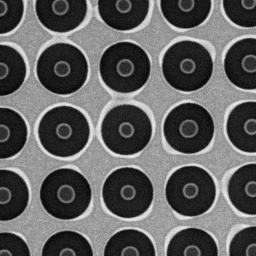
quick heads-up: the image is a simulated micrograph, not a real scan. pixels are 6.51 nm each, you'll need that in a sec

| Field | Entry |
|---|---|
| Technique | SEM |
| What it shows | an array of small figures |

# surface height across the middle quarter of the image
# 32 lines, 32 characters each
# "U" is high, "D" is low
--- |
UDDDDDUUUDDDDUUUUDDDDDUUDDDDDUUU
UDDDDDUUUDDDDUUUUDDDDDUUDDDDDDUU
UDDDDDUUUDDDDDUUUDDDDDUUUDDDDDDD
DDDDDDUUUDDDDDDDDDDDDUUUUDDDDDDD
DDDDDUUUUDDDDDDDDDDDDUUUUUDDDDDD
DDDDDUUUUUDDDDDDDDDDUUUUUUUDDDDD
DDDDUUUUUUUDDDDDDDDUUUUUUUUUDDDD
DDUUUUUUUUUUDDDDDUUUUUUUUUUUUUUU
UUUUUUUUUUUUUUUUUUUUUUUUUUUUUUUU
UUUUUUUUUUUUUDDDDUUUUUUUUUUUUUDD
DDUUUUUUUUUDDDDDDDDUUUUUUUUUDDDD
DDDDUUUUUUDDDDDDDDDDDUUUUUUDDDDD
DDDDDUUUUUDDDDDDDDDDDDUUUUDDDDDD
DDDDDDUUUDDDDDDDDDDDDDUUUDDDDDDD
DDDDDDUUUDDDDDDDDDDDDDUUUDDDDDUU
UDDDDDDUUDDDDDUUUDDDDDUUUDDDDUUU
UUDDDDDUUDDDDDUUUDDDDDUUUDDDDUUU
UUDDDDDUUDDDDDUUUDDDDDUUUDDDDDUU
DDDDDDDUUDDDDDDDDDDDDDUUUDDDDDDD
DDDDDDUUUDDDDDDDDDDDDUUUUDDDDDDD
DDDDDDUUUUDDDDDDDDDDDUUUUUDDDDDD
DDDDDUUUUUUDDDDDDDDUUUUUUUDDDDDD
DDDDUUUUUUUUDDDDDDUUUUUUUUUUUUDD
DDUUUUUUUUUUUUUUUUUUUUUUUUUUUUUU
UUUUUUUUUUUUUUUUUUUUUUUUUUUUUUUU
UUUUUUUUUUUUUUUUUUUUUUUUUUUUUUDD
DDDUUUUUUUUUDDDDDDDUUUUUUUUUDDDD
DDDDUUUUUUUDDDDDDDDDUUUUUUDDDDDD
DDDDDUUUUUUDDDDDDDDDDUUUUUDDDDDD
DDDDDDUUUUDDDDDDDDDDDDUUUUDDDDDD
DDDDDDDUUUDDDDDDDDDDDDUUUDDDDDUU
UUDDDDDUUDDDDDUUUUDDDDDUUDDDDDUU